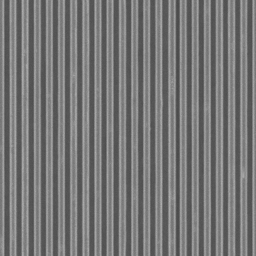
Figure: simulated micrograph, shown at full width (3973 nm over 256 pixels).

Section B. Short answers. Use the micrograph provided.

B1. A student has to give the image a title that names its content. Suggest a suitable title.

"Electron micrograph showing parallel lines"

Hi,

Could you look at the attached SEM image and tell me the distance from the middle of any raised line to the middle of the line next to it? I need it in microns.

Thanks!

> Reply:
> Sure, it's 0.188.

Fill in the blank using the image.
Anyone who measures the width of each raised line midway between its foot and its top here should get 93.1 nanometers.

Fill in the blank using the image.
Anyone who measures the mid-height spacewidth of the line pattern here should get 93.1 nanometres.